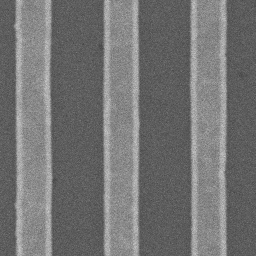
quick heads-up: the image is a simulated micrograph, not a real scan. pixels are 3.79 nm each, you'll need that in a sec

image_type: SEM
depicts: one or a few lines or trenches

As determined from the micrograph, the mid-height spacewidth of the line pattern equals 0.219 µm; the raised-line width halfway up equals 111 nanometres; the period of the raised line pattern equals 331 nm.